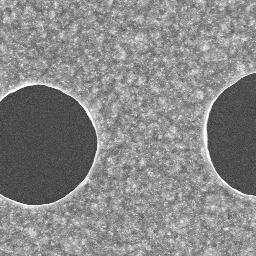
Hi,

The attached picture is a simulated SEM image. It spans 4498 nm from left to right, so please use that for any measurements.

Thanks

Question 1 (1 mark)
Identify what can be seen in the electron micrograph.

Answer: holes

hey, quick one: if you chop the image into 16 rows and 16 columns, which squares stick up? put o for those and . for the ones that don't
oooooooooooooooo
oooooooooooooooo
oooooooooooooooo
oooooooooooooooo
oooooooooooooooo
o..ooooooooooo..
.....oooooooo...
......ooooooo...
......ooooooo...
......ooooooo...
......ooooooo...
.....ooooooooo..
o...oooooooooooo
oooooooooooooooo
oooooooooooooooo
oooooooooooooooo